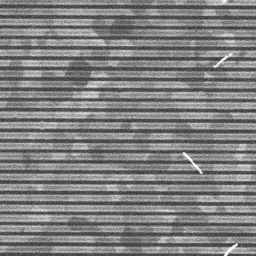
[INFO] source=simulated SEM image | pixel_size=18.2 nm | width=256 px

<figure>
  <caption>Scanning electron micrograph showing parallel lines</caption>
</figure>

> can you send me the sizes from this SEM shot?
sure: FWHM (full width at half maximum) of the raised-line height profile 0.0797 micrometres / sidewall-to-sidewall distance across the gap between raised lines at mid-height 112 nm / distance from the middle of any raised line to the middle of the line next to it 188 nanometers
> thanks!